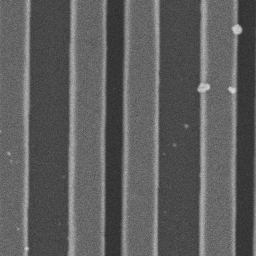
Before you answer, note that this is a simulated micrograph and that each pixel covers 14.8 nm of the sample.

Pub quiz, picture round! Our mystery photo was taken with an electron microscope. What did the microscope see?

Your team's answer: lines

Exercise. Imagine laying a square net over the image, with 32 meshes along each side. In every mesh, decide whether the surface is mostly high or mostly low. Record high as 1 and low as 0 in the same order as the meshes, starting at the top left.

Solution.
11110000011110001111000001111100
11110000011110001111000001111100
11110000011110001111000001111100
11110000011110001111000001111100
11110000011110001111000001111100
11110000011110001111000001111100
11110000011110001111000001111100
11110000011110001111000001111100
11110000011110001111000001111100
11110000011110001111000001111100
11110000011110001111000001111100
11110000011110001111000001111100
11110000011110001111000001111000
11110000011110001111000001111000
11110000011110011111000001111000
11110000011110001111000001111000
11110000011110011111000001111000
11110000011110011111000001111000
11110000011110011111000001111000
11110000011110011111000001111000
11110000011110011111000001111000
11110000011110011111000001111000
11100000011110011111000001111000
11100000011110011111000001111000
11100000011110011111000001111000
11100000011110011111000001111000
11100000011110011111000001111000
11100000011110011111000001111000
11100000011110011111000001111000
11100000011110011111000001111000
11100000011110011111000001111000
11110000011110011111000001111000